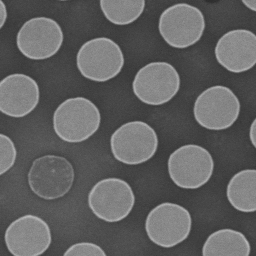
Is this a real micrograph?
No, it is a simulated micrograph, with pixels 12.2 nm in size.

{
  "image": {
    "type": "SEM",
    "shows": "a regular array of raised bodies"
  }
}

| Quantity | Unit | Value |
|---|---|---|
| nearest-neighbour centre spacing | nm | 748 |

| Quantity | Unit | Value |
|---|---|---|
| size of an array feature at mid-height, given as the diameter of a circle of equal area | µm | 0.537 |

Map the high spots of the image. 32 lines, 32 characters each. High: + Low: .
.............+++++.............+
+............+++++...++++.......
+...++........+++...+++++.......
...++++.............+++++.......
..++++++............+++++...++++
..++++++...+++.......+++...+++++
...++++...+++++............+++++
..........+++++............+++++
..........+++++...++++......+++.
.++........+++...+++++..........
+++++............+++++..........
+++++............+++++....+++...
+++++....++.......+++....+++++..
++++...+++++............++++++..
..+....+++++............++++++..
.......+++++....++.......++++...
.......+++++..+++++............+
+.......++....++++++...........+
++............++++++...++.......
++............+++++..+++++......
++...................++++++.....
+....................+++++....++
.............++.......++++...+++
............++++.......+....++++
...........++++++...........++++
...........++++++...++.......+++
............++++...++++.........
..+++........++...++++++........
.+++++............++++++........
.+++++.............++++...++++..
.+++++....+.........++....+++++.
.++++...+++++............++++++.